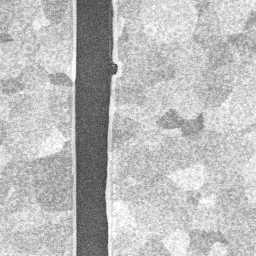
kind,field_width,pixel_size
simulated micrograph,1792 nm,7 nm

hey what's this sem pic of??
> one or a few lines or trenches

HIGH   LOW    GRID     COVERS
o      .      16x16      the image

ooooo..ooooooooo
ooooo..ooooooooo
ooooo..ooooooooo
ooooo..ooooooooo
ooooo..ooooooooo
ooooo..ooooooooo
ooooo..ooooooooo
ooooo..ooooooooo
ooooo..ooooooooo
ooooo..ooooooooo
ooooo..ooooooooo
ooooo..ooooooooo
ooooo..ooooooooo
ooooo..ooooooooo
ooooo..ooooooooo
ooooo..ooooooooo